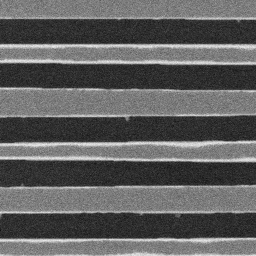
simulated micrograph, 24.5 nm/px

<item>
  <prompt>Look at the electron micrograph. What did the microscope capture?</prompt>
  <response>lines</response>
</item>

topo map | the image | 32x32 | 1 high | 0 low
11111111111111111111111111111111
11111111111111111111111111111111
00000000000000000000000000000000
00000000000000000000000000000000
00000000000000000000000000000000
00000000000000000000000000000000
11111111111111111111111111111111
11111111111111111111111111111111
00000000000000000000000000000000
00000000000000000000000000000000
00000000000000000000000000000000
11111111111111111111111111111111
11111111111111111111111111111111
11111111111111111111111111111111
11111111111111110000000000000000
00000000000000000000000000000000
00000000000000000000000000000000
00000000000000000000000000000000
11111111111111111111111111111111
11111111111111111111111111111111
00000000000000000000000000000000
00000000000000000000000000000000
00000000000000000000000000000000
00111100111111111111111111111111
11111111111111111111111111111111
11111111111111111111111111111111
11111111110000000011101100000000
00000000000000000000000000000000
00000000000000000000000000000000
00000000000000000000000000000000
11111111111111111111111111111111
11111111111111111111111111111111